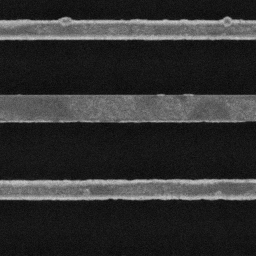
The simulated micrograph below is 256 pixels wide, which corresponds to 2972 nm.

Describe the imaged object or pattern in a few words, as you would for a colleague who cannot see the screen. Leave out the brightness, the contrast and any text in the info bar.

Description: lines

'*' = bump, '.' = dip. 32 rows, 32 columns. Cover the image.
................................
................................
.......**...................*...
********************************
********************************
................................
................................
................................
................................
................................
................................
................................
********************************
********************************
********************************
................................
................................
................................
................................
................................
................................
................................
................................
********************************
********************************
................................
................................
................................
................................
................................
................................
................................